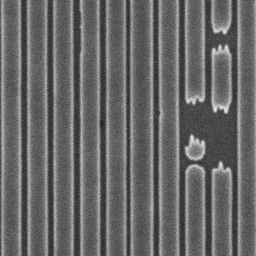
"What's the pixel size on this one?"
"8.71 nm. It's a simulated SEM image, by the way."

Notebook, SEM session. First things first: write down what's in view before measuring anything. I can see parallel lines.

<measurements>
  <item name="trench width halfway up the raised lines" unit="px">7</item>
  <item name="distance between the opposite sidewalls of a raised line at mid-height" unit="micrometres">0.166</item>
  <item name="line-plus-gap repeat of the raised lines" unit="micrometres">0.229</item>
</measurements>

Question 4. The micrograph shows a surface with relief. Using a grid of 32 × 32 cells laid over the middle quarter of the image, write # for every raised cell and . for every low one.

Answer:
##..#####..####..#####..####...#
##..#####..####..#####..####...#
##..#####..####..#####..####...#
##..#####..####..#####..####..##
##..#####..####..#####..####..##
##..#####..####..#####..####..##
##..#####..####..#####..####..##
##..#####..####..#####..####..##
##..#####..####..#####..####..##
##..#####..####..#####..####....
##..#####..####..#####..####....
##..#####..####..#####..####....
##..#####..####..#####..####....
##..#####..####..#####..####....
##..#####..####..#####..####....
##..#####..####..#####..####....
##..#####..####..#####..####....
##..#####..####..#####..#####...
##..#####..####..#####..#####...
##..#####..####..#####..#####...
##..#####..####..#####..#####..#
##..#####..####..#####..#####.##
##..#####..####..#####..#####..#
##..#####..####..#####..#####...
##..#####..####..#####..#####...
##..#####..####..#####..#####...
##..#####..####..#####..#####..#
##..#####..####..#####..#####.##
##..#####..####..#####..#####..#
##..#####..####..#####..#####..#
##..#####..####..#####..#####..#
##..#####..####..#####..#####..#